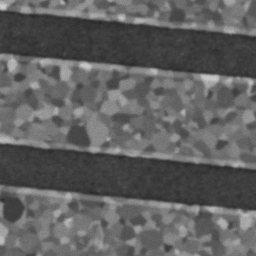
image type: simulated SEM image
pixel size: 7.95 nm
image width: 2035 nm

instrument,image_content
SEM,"one or a few lines or trenches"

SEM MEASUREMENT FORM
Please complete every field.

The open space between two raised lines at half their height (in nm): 380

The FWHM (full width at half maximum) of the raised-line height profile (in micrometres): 0.67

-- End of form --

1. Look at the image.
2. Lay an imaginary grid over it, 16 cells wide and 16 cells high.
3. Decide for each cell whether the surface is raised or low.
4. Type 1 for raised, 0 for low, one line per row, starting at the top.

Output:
1111111111111111
0000000000111111
0000000000000000
0000000000000000
1111111111000000
1111111111111111
1111111111111111
1111111111111111
1111111111111111
0000000111111111
0000000000000000
0000000000000000
1111111000000000
1111111111111111
1111111111111111
1111111111111111